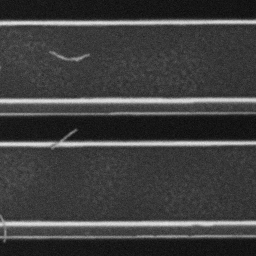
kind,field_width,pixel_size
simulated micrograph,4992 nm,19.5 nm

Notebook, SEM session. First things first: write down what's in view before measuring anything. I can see lines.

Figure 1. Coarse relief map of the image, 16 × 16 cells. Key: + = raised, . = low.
++++++++++++++++
................
................
................
................
................
++++++++++++++++
++++++++++++++++
++++++++++++++++
................
................
................
................
................
++++++++++++++++
++++++++++++++++